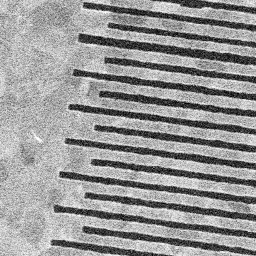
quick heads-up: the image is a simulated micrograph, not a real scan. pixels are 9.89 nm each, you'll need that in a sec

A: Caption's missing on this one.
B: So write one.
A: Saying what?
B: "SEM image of parallel lines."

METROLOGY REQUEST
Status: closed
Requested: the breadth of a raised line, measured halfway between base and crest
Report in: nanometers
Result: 89.5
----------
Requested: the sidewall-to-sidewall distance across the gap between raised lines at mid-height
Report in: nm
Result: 78.5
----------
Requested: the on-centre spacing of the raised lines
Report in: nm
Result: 169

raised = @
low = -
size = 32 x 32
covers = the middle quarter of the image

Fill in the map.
@@@@@@@@@@@@@@----------------@@
@@---@@@@@@@@@@@@@@@@@----------
@@----------@@@@@@@@@@@@@@@@@---
@@@@@--------------@@@@@@@@@@@@@
@@@@@@@@@@@---------------@@@@@@
@@@@@@@@@@@@@@@@@@--------------
@@@@@@@@@@@@@@@@@@@@@@@@@@------
@@@@@@@@@----------@@@@@@@@@@@@@
@@@@@@@@@-----------------@@@@@@
@@@@@@@@@@@@@@@@@---------------
@------@@@@@@@@@@@@@@@@---------
@--------------@@@@@@@@@@@@@@@@@
@@@@@@-----------------@@@@@@@@@
@@@@@@@@@@@@@@@@-------------@@@
@@@@@@@@@@@@@@@@@@@@@@----------
@@@@@@@------@@@@@@@@@@@@@@@@---
@@@@@@@@------------@@@@@@@@@@@@
@@@@@@@@@@@@@---------------@@@@
--@@@@@@@@@@@@@@@@@@------------
----------@@@@@@@@@@@@@@@@------
@@@--------------@@@@@@@@@@@@@@@
@@@@@@@@@----------------@@@@@@@
@@@@@@@@@@@@@@@@@@--------------
@@@@@@@-@@@@@@@@@@@@@@@@--------
@@@@@@---------@@@@@@@@@@@@@@@@@
@@@@@@@-----------------@@@@@@@@
@@@@@@@@@@@@@@@----------------@
-----@@@@@@@@@@@@@@@@@----------
-------------@@@@@@@@@@@@@@@@@--
@@@@@--------------@@@@@@@@@@@@@
@@@@@@@@@@@@-----------------@@@
@@@@@@@@@@@@@@@@@@@@------------